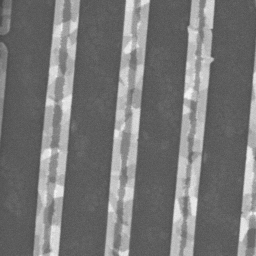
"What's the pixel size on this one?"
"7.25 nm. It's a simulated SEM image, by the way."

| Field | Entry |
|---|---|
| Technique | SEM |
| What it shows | one or a few lines or trenches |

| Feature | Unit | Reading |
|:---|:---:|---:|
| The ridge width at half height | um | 0.13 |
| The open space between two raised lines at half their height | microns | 0.369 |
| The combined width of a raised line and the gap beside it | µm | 0.491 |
